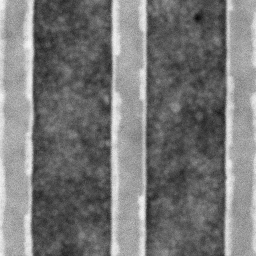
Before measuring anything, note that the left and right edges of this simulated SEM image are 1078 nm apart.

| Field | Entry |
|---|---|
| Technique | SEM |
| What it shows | one or a few lines or trenches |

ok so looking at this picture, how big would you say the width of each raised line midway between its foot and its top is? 0.133 microns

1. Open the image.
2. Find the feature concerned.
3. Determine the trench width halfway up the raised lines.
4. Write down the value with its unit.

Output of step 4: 345 nanometres